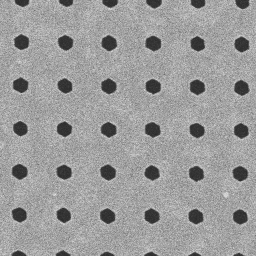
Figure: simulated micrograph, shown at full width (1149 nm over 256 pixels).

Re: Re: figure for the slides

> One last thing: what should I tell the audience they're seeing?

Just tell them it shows a regular array of holes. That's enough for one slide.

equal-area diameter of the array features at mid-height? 66.7 nanometres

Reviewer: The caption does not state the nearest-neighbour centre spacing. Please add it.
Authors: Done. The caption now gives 43.1 pixels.